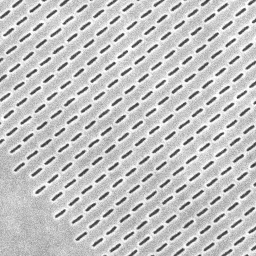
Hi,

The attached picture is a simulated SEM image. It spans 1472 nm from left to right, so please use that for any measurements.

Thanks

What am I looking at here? a regular array of holes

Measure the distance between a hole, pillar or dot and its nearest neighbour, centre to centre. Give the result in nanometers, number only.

99.1